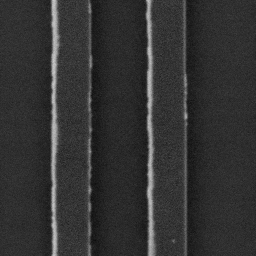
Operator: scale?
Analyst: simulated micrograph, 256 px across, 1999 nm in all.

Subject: lines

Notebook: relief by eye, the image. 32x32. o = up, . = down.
.......oooo........oooo.........
.......oooo.......ooooo.........
.......oooo.......ooooo.........
.......oooo........oooo.........
.......oooo........oooo.........
.......oooo........oooo.........
.......oooo........oooo.........
.......oooo........oooo.........
.......oooo........oooo.........
.......oooo........oooo.........
.......oooo........oooo.........
.......oooo........oooo.........
.......oooo........oooo.........
.......oooo........oooo.........
.......oooo........oooo.........
.......oooo........oooo.........
.......oooo........oooo.........
.......oooo........oooo.........
.......oooo........oooo.........
.......oooo........oooo.........
.......oooo........oooo.........
.......oooo........oooo.........
.......oooo........oooo.........
.......oooo........oooo.........
.......oooo........oooo.........
.......oooo........oooo.........
.......oooo........oooo.........
.......oooo........oooo.........
.......oooo........oooo.........
.......oooo........oooo.........
.......oooo........oooo.........
.......oooo........oooo.........